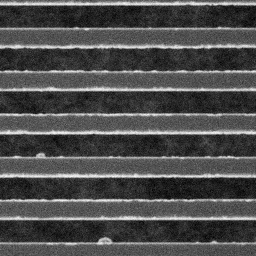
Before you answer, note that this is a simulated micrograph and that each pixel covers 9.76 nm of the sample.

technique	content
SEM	lines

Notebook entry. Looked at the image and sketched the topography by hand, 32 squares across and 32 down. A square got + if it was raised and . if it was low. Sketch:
++++++++++++++++++++++++++++++++
................................
................................
.........+.................++...
++++++++++++++++++++++++++++++++
++++++++++++++++++++++++++++++++
................................
................................
................................
++++++++++++++++++++++++++++++++
++++++++++++++++++++++++++++++++
................................
................................
................................
++++++++++++++++++++++++++++++++
++++++++++++++++++++++++++++++++
++++++++++++++++++++++++++++++++
................................
................................
................................
++++++++++++++++++++++++++++++++
++++++++++++++++++++++++++++++++
................................
................................
................................
++++++++++++++++++++++++++++++++
++++++++++++++++++++++++++++++++
................................
................................
................................
++++++++++++++++++++++++++++++++
++++++++++++++++++++++++++++++++